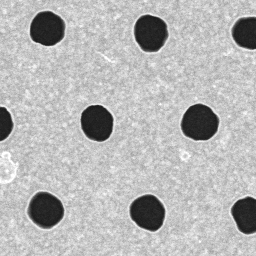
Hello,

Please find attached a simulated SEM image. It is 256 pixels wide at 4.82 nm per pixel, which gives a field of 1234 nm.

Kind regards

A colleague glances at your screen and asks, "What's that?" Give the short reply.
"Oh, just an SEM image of holes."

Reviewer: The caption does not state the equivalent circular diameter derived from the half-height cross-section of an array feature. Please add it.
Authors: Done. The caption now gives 167 nanometers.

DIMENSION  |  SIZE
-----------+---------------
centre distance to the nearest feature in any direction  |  492 nm